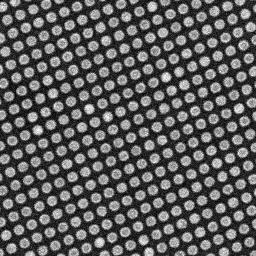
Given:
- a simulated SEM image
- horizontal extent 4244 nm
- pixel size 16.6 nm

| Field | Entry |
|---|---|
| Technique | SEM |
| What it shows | a regular array of raised bodies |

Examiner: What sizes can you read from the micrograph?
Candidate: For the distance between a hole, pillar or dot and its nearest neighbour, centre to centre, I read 0.228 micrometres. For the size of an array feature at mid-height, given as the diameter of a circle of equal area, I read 0.147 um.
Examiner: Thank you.